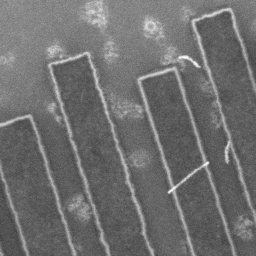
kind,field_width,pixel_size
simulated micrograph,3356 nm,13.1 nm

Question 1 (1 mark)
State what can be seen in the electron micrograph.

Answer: one or a few lines or trenches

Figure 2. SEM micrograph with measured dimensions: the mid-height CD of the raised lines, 522 nanometres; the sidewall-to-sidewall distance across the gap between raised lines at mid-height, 420 nm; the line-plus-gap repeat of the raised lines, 1020 nanometers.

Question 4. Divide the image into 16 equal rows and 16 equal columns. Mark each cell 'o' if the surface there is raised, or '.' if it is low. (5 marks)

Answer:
................
............ooo.
............ooo.
.............oo.
...ooo....o..ooo
....oo...oo..ooo
....ooo..ooo..oo
.o..ooo..ooo..oo
oo..ooo...oo..oo
ooo..oo...ooo..o
ooo..ooo..ooo..o
ooo..ooo...oo..o
.ooo..oo...ooo..
.ooo..ooo..ooo..
.ooo..ooo...oo..
..ooo..oo...ooo.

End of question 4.